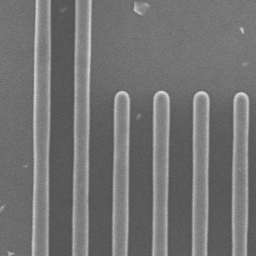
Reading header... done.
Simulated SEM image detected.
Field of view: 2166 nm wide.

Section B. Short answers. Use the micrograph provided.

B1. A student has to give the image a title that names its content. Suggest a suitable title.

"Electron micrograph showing groups of lines, slits or small figures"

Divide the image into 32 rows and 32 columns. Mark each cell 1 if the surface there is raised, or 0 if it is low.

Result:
00000100011000000000000000000000
00000100011000000000000000000000
00001100011000000000000000000000
00001100011000000000000000000000
00001100011000000000000000000000
00001100011000000000000000000000
00001100011000000000000000000000
00001100011000000000000000000000
00001100011000000000000000000000
00001100011000000000000000000000
00001100011000000000000000000000
00001100011000000000000000000000
00001100011000110001100011000110
00001100011000110001100011000110
00001100011000110001100011000110
00001100011000110001100011000110
00001100011000110001100011000110
00001100011000110001100011000110
00001100011000110001100011000110
00001100011000110001100011000110
00001100011000110001100011000110
00001100011000110001100011000110
00001100011000110001100011000110
00001100011000110001100011000110
00001100011000110001100011000110
00001100011000110001100011000110
00001100011000110001100011000110
00001100011000110001100011000110
00001100011000110001100011000110
00001100011000110001100011000110
00001100011000110001100011000110
00001100011000110001100011000110